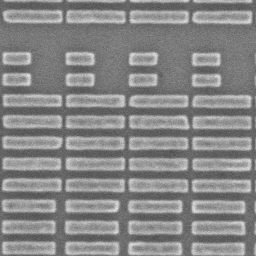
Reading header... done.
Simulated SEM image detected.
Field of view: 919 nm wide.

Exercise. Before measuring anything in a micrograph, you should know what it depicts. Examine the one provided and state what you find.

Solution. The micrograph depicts wiring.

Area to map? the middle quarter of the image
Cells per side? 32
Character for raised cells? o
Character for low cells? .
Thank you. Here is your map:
................................
................................
................................
.oooooo.........ooooooo.........
.oooooo.........ooooooo.........
................................
................................
................................
.oooooooooooooo..oooooooooooooo.
.oooooooooooooo.ooooooooooooooo.
.ooo.oo..oooooo..oooooooooooooo.
................................
................................
.oooooooooooooo.ooooooooooooooo.
.oooooooooooooo.ooooooooooooooo.
.oooooooooooooo.ooooooooooooooo.
................................
................................
.ooo............................
.oooooooooooooo.ooooooooooooooo.
.oooooooooooooo.ooooooooooooooo.
................................
................................
................................
.oooooooooooooo.ooooooooooooooo.
.oooooooooooooo.ooooooooooooooo.
......................ooo.ooo...
................................
................................
.oooooooooooooo.ooooooooooooooo.
ooooooooooooooo.ooooooooooooooo.
.oooooooooooooo..oooooooooooooo.